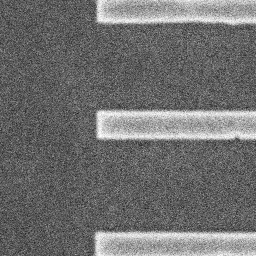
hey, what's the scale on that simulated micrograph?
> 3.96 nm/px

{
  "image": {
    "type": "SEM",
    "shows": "one or a few lines or trenches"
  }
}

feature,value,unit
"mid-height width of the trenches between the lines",372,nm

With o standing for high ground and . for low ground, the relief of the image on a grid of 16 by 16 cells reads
......oooooooooo
................
................
................
................
................
................
......oooooooooo
......oooooooooo
................
................
................
................
................
................
......oooooooooo